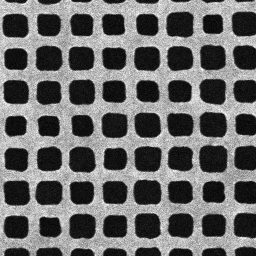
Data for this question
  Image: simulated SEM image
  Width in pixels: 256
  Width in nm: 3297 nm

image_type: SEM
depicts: a regular array of holes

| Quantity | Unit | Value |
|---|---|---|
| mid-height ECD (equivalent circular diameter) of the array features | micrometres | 0.339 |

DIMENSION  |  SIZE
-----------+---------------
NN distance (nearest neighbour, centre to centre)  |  421 nanometers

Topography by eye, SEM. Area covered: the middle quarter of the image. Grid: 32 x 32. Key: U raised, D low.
UDDDDDDUUUDDDDDUUUDDDDDDUUDDDDDD
UUDDDDUUUUUDDDUUUUUDDDDUUUUDDDDU
UUUUUUUUUUUUUUUUUUUUUUUUUUUUUUUU
UUUUUUUUUUUUUUUUUUUUUUUUUUUUUUUU
UUDDDDDUUUDDDDDUUUUDDDDUUUDDDDDU
UDDDDDDDUUDDDDDUUUDDDDDDUUDDDDDD
UDDDDDDDUUDDDDDUUUDDDDDDUUDDDDDD
UDDDDDDDUUDDDDDUUUDDDDDDUUDDDDDD
UDDDDDDDUUDDDDDUUUDDDDDDUUDDDDDD
UUDDDDDUUUDDDDDUUUUUDDDUUUUDDDDU
UUUUUUUUUUUUUUUUUUUUUUUUUUUUUUUU
UUUUUUUUUUUUUUUUUUUUUUUUUUUUUUUU
UUUUUUUUUUDDDDDUUUDDDDDUUUDDDDDU
UUDDDDDUUDDDDDDDUDDDDDDDUUDDDDDD
UUDDDDDUUDDDDDDDUDDDDDDDUUDDDDDD
UUDDDDDUUDDDDDDDUDDDDDDDUUDDDDDD
UUDDDDDUUDDDDDDDUUDDDDDDUUDDDDDD
UUDDDDDUUUDDDDDDUUDDDDDDUUUDDDDD
UUUUUUUUUUUDDDUUUUUUDDUUUUUUUUUU
UUUUUUUUUUUUUUUUUUUUUUUUUUUUUUUU
UUUUUUUUUUUUUUUUUUUUUUUUUUUUUDDU
UUDDDDDUUUDDDDDUUUDDDDDDUUDDDDDD
UDDDDDDUUUDDDDDDUUDDDDDDUUDDDDDD
UDDDDDDDUUDDDDDDUUDDDDDDUUDDDDDD
UDDDDDDDUUDDDDDDUUDDDDDDUUDDDDDD
UDDDDDDDUUDDDDDDUUDDDDDDUUDDDDDD
UUDDDDDUUUUUDDUUUUDDDDDUUUUDDDDU
UUUUUUUUUUUUUUUUUUUUUUUUUUUUUUUU
UUUUUUUUUUUUUUUUUUUUUUUUUUUUUUUU
UUDDDDDUUUDDDDDUUUDDDDDDUUUDDDDU
UDDDDDDDUUDDDDDDUUDDDDDDUUDDDDDD
UDDDDDDDUUDDDDDDUDDDDDDDUUDDDDDD